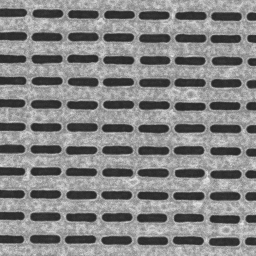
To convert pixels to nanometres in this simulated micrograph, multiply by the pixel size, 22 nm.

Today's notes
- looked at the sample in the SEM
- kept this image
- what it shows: a regular array of holes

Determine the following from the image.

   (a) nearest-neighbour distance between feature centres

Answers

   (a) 486 nm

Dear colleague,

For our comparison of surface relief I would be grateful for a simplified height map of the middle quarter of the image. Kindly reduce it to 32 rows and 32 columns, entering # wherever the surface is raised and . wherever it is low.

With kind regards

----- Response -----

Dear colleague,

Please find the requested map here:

################################
################################
################################
##......###......#####...#######
#........#.......##........#....
##......##......###.......##....
################################
################################
################################
#.......##.......##.......###...
#.......##.......##........#....
######.#####################....
################################
################################
################################
#.......##.......##.......##....
#.......##.......##.......##....
################################
################################
################################
#.......###.....####..########..
#.......#........#........#.....
#......###.......##.......##....
################################
################################
################################
........##.......##.......##....
........##.......#........##....
#############################...
################################
################################
################################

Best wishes